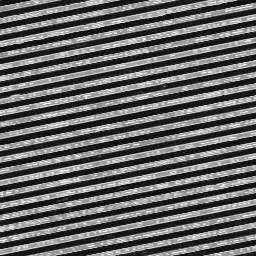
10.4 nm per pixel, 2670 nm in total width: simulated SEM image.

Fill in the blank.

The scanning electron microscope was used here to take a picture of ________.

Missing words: parallel lines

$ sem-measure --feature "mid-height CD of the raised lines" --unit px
4.9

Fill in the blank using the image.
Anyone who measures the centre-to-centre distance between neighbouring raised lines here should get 0.118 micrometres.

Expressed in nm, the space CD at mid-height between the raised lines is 61.4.